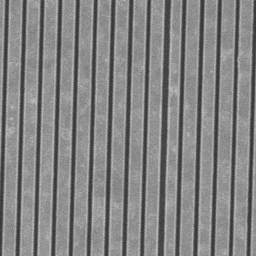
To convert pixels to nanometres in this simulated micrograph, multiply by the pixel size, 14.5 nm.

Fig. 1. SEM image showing parallel lines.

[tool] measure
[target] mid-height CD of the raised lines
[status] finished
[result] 0.183 um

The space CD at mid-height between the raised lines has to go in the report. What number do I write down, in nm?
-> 72.7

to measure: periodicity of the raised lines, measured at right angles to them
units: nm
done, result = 258